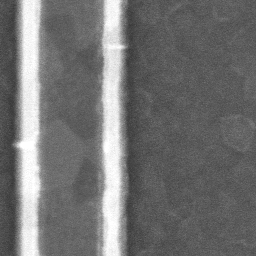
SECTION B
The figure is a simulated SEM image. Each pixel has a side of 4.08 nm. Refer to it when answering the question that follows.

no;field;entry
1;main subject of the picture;one or a few lines or trenches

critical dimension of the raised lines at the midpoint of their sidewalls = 0.341 µm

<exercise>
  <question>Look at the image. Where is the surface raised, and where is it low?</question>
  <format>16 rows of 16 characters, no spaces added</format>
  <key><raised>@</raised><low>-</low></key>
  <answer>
--@@@@@---------
--@@@@@---------
--@@@@@---------
--@@@@@---------
--@@@@@---------
--@@@@@---------
--@@@@@---------
--@@@@@---------
--@@@@@---------
--@@@@@---------
--@@@@@---------
--@@@@@---------
--@@@@@---------
--@@@@@---------
--@@@@@---------
--@@@@@---------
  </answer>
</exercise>